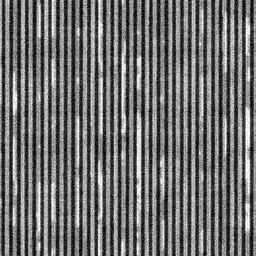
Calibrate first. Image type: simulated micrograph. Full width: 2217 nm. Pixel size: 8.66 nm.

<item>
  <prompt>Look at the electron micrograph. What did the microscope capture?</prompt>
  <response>parallel lines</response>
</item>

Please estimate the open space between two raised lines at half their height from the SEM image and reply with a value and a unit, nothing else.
0.039 µm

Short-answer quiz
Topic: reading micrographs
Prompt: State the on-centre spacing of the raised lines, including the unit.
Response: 67.1 nanometers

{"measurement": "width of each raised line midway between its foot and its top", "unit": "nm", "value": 26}